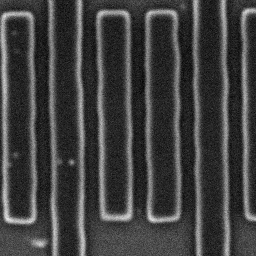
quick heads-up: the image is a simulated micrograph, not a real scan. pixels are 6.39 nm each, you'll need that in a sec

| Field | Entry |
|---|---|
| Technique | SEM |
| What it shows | groups of lines, slits or small figures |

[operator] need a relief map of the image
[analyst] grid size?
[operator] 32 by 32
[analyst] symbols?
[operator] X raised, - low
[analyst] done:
------XXXX--------------XXXX----
------XXXX---XXX---XXX--XXXX---X
XXXX--XXXX--XXXX--XXXX--XXXX--XX
XXXX--XXXX--XXXX--XXXX--XXXX--XX
XXXX--XXXX--XXXX--XXXX--XXXX--XX
XXXX--XXXX--XXXX--XXXX--XXXX--XX
XXXX--XXXX--XXXX--XXXX--XXXX--XX
XXXX--XXXX--XXXX--XXXX--XXXX--XX
XXXX--XXXX--XXXX--XXXX--XXXX--XX
XXXX--XXXX--XXXX--XXXX--XXXX---X
XXXX--XXXX--XXXX--XXXX--XXXX---X
XXXX--XXXX--XXXX--XXXX--XXXX---X
XXXX--XXXX--XXXX--XXXX--XXXX---X
XXXX--XXXX--XXXX--XXXX---XXX---X
XXXX--XXXX--XXXX--XXXX---XXX---X
XXXX--XXXX---XXX--XXXX---XXX---X
XXXX--XXXX---XXX--XXXX--XXXX---X
XXXX---XXX---XXX--XXXX--XXXX---X
XXXX---XXX---XXX--XXXX---XXX---X
XXXX---XXX---XXX--XXXX---XXX---X
XXXX---XXX---XXX---XXX---XXX---X
XXXX---XXX---XXX---XXX---XXX---X
XXXX---XXX---XXX---XXXX--XXX---X
-XXX---XXX---XXX---XXXX--XXX---X
-XXX---XXX---XXX---XXX---XXX---X
-XXX---XXX---XXX---XXX---XXX---X
-XXX---XXX---XXX---XXX---XXX---X
-XXX---XXX---------XXX---XXXX---
-------XXX---------------XXXX---
-------XXX---------------XXXX---
-------XXX---------------XXXX---
-------XXX---------------XXX----